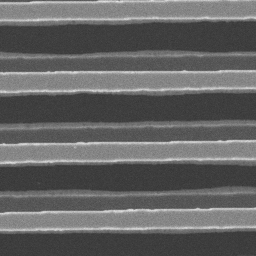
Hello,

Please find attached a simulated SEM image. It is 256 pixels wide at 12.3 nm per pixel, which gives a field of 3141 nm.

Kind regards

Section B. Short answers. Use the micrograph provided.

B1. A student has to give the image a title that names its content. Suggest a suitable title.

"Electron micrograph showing lines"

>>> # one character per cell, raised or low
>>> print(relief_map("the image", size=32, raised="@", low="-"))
@@@@@@@@@@@@@@@@@@@@@@@@@@@@@@@@
@@@@@@@@@@@@@@@@@@@@@@@@@@@@@@@@
@@@@@@@@@@@@@@@@----------------
--------------------------------
--------------------------------
--------------------------------
--------------------------------
@@@@@@@@@@@@@@@@@@@@@@@@@@@@@@@@
@@@@@@@@@@@@@@@@@@@@@@@@@@@@@@@@
@@@@@@@@@@@@@@@@@@@@@@@@@@@@@@@@
@@@@@@@@@@@@@@@@@@@@@@@@@@@@@@@@
@@@@@-@@------------------------
--------------------------------
--------------------------------
--------------------------------
--------------------------------
@@@@@@@@@@@@@@@@@@@@@@@@@@@@@@@@
@@@@@@@@@@@@@@@@@@@@@@@@@@@@@@@@
@@@@@@@@@@@@@@@@@@@@@@@@@@@@@@@@
@@@@@@@@@@@@@@@@@@@@@@@@@@@@@@@@
@-------------------------------
--------------------------------
--------------------------------
--------------------------------
@@@@@@@@@@@@@@@@@@@@@@@@@@@@@@@@
@@@@@@@@@@@@@@@@@@@@@@@@@@@@@@@@
@@@@@@@@@@@@@@@@@@@@@@@@@@@@@@@@
@@@@@@@@@@@@@@@@@@@@@@@@@@@@@@@@
@@@@@@@@@@@@@@@@@@@@@@@@@@@@@@@@
--------------------------------
--------------------------------
--------------------------------